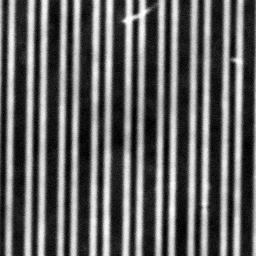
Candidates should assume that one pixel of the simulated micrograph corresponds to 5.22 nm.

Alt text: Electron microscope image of parallel lines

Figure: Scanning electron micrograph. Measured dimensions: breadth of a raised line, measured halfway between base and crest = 5.63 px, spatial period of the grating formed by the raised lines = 85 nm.